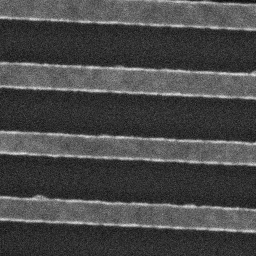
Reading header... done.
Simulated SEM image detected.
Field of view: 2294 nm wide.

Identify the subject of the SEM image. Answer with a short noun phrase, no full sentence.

lines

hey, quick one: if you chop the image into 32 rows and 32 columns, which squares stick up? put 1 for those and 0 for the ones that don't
11111111111111111111111111111100
11111111111111111111111111111111
00000011111111111111111111111111
00000000000000000000000000111111
00000000000000000000000000000000
00000000000000000000000000000000
00000000000000000000000000000000
00000000000000000000000000000000
11111111111111100000000000000000
11111111111111111111111111111111
11111111111111111111111111111111
00000000000000111111111111111111
00000000000000000000000000000000
00000000000000000000000000000000
00000000000000000000000000000000
00000000000000000000000000000000
00000000000000000000000000000000
11111111111111111111110000000000
11111111111111111111111111111111
00000011111111111111111111111111
00000000000000000000000000001111
00000000000000000000000000000000
00000000000000000000000000000000
00000000000000000000000000000000
00000000000000000000000000000000
11111111111111111110000000000000
11111111111111111111111111111111
01111111111111111111111111111111
00000000000000000000011111111111
00000000000000000000000000000000
00000000000000000000000000000000
00000000000000000000000000000000